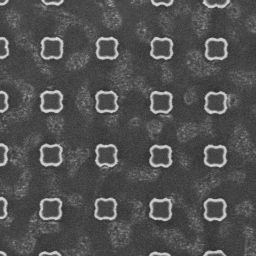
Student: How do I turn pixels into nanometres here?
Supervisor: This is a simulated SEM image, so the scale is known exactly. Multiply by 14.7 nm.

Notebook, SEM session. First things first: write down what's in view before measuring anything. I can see a regular array of raised bodies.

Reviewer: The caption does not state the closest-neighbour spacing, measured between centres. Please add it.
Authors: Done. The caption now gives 782 nm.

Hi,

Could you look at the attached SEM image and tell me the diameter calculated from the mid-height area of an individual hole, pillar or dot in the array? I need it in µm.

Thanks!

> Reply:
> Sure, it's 0.321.